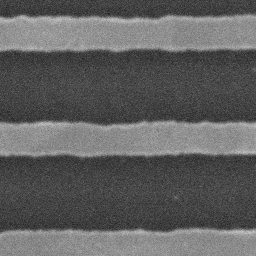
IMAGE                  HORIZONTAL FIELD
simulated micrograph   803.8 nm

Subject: lines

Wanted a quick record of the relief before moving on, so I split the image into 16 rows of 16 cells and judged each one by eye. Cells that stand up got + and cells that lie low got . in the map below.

................
++++++++++++++++
++++++++++++++++
................
................
................
................
................
++++++++++++++++
++++++++++++++++
................
................
................
................
.++++..++..+++++
++++++++++++++++